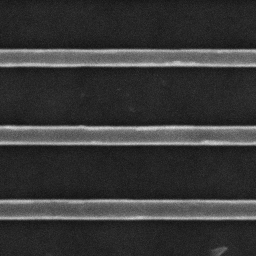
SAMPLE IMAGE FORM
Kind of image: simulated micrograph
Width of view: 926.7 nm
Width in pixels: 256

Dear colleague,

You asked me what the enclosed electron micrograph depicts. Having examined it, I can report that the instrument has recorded one or a few lines or trenches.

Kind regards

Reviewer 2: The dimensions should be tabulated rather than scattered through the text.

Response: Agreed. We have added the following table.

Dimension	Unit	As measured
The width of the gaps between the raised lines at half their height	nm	215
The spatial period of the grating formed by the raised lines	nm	274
